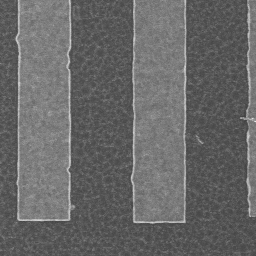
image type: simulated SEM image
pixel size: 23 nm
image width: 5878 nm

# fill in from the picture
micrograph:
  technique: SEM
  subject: one or a few lines or trenches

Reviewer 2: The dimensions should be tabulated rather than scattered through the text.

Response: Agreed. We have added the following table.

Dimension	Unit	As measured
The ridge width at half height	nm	1180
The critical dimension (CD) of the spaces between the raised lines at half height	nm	1470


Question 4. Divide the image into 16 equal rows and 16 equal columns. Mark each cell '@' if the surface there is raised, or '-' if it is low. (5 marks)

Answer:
-@@@----@@@@----
-@@@----@@@@----
-@@@----@@@@----
-@@@----@@@@----
-@@@----@@@@----
-@@@----@@@@----
-@@@----@@@@----
-@@@----@@@@---@
-@@@----@@@@---@
-@@@----@@@@----
-@@@----@@@@----
-@@@----@@@@----
-@@@----@@@@----
-@@@----@@@-----
----------------
----------------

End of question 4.